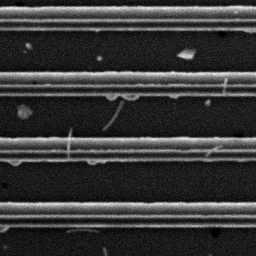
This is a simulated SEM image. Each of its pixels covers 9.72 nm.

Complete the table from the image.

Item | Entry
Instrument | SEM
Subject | lines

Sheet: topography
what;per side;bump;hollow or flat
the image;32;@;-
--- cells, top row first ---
--------------------------------
@@@@@@@@@@@@@@@@@@@@@@@@@@@@@@@@
@@@@@@@@@@@@@@@@@@@@@@@@@@@@@@@@
@@@@@@@@@@@@@@@@@@@@@@@@@@@@@@@@
--------------------------------
--------------------------------
--------------------------------
--------------------------------
--------------------------------
@@@@@@@@@@@@@@@@@@@@@@@@@@@@@@@@
@@@@@@@@@@@@@@@@@@@@@@@@@@@@@@@@
@@@@@@@@@@@@@@@@@@@@@@@@@@@@@@@@
--------------------------------
--------------------------------
--------------------------------
--------------------------------
--------------------------------
@@@@@@@@@@@@@@@@@@@@@@@@@@@@@@@@
@@@@@@@@@@@@@@@@@@@@@@@@@@@@@@@@
@@@@@@@@@@@@@@@@@@@@@@@@@@@@@@@@
-@---------@--------------------
--------------------------------
--------------------------------
--------------------------------
--------------------------------
@@---@@@@@-@@@@@@--@@@@@-@@@@@@@
@@@@@@@@@@@@@@@@@@@@@@@@@@@@@@@@
@@@@@@@@@@@@@@@@@@@@@@@@@@@@@@@@
@-------------------------------
--------------------------------
--------------------------------
--------------------------------